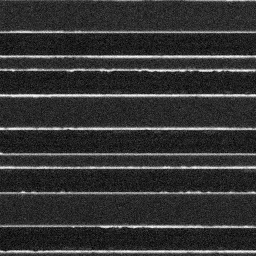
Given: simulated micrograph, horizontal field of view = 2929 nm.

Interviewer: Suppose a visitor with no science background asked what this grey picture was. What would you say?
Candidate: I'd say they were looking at lines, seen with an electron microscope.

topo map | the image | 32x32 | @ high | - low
@@@@@@@@@@@@@@@@@@@@@@@@@@@@@@@@
@@@@@@@@@@@@@@@@@@@@@@@@@@@@@@@@
@@@@@@@@@@@@@@@@@@@@@@@@@@@@@@@@
@@@@@@@@@@@@@@@@@@@@@@@@@@@@@@@@
--------------------------------
--------------------------------
--------------------------------
@@@@@@@@@@@@@@@@@@@@@@@@@@@@@@@@
@@@@@@@@@@@@@@@@@@@@@@@@@@@@@@@@
--------------------------------
--------------------------------
--------------------------------
@@@@@@@@@@@@@@@@@@@@@@@@@@@@@@@@
@@@@@@@@@@@@@@@@@@@@@@@@@@@@@@@@
@@@@@@@@@@@@@@@@@@@@@@@@@@@@@@@@
@@@@@@@@@@@@@@@@@@@@@@@@@@@@@@@@
--------------------------------
--------------------------------
--------------------------------
@@@@@@@@@@@@@@@@@@@@@@@@@@@@@@@@
@@@@@@@@@@@@@@@@@@@@@@@@@@@@@@@@
--------------------------------
--------------------------------
--------------------------------
@@@@@@@@@@@@@@@@@@@@@@@@@@@@@@@@
@@@@@@@@@@@@@@@@@@@@@@@@@@@@@@@@
@@@@@@@@@@@@@@@@@@@@@@@@@@@@@@@@
@@@@@@@@@@@@@@@@@@@@@@@@@@@@@@@@
--------------------------------
--------------------------------
--------------------------------
@@@@-@@@@@@@@@@@@@@@@@@@@@@@@@@@